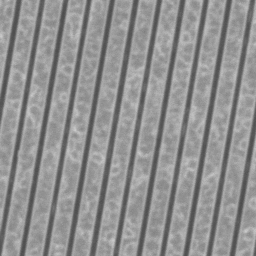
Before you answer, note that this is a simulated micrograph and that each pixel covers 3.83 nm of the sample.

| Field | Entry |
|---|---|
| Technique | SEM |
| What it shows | parallel lines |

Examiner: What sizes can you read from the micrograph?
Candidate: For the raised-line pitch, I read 0.088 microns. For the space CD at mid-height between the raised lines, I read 0.025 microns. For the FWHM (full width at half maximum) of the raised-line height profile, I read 61.3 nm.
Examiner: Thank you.